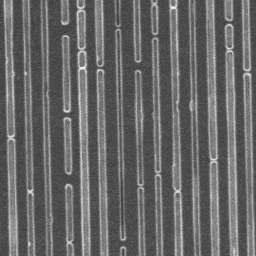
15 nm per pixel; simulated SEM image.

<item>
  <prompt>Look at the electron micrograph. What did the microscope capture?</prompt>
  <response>parallel lines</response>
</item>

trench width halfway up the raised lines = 0.0731 microns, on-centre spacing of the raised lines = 275 nm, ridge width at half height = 0.204 microns